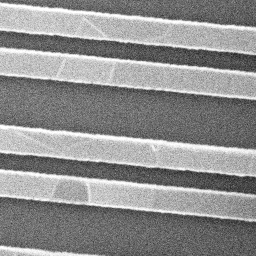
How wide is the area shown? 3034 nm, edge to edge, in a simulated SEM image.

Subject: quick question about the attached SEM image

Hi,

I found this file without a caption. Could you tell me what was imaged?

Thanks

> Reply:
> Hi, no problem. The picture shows lines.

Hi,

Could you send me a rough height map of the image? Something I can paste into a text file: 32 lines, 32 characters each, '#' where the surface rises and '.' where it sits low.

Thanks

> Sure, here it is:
#...............................
#########.......................
####################............
###############################.
.........#######################
...................#############
#####........................###
##############..................
#########################.......
..##############################
.............###################
.......................#########
................................
................................
................................
................................
#######.........................
##################..............
##########################......
......##########################
...............#################
##.........................#####
###########.....................
######################..........
################################
..........######################
......................##########
...............................#
................................
................................
................................
#####...........................